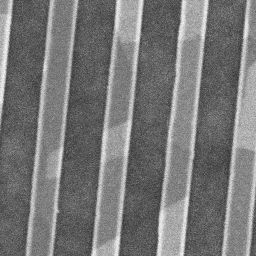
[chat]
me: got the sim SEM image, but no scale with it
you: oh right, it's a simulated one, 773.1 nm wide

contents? one or a few lines or trenches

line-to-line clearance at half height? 41.5 px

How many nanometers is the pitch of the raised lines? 197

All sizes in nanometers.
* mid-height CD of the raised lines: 73.4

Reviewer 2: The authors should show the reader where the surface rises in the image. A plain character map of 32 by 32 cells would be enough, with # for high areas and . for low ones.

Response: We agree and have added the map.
#.....####.....###.....###.....#
#.....####.....###.....###.....#
#.....###......##......###.....#
#.....###.....###......###.....#
#.....###.....###......##......#
#.....###.....###.....###......#
#.....###.....###.....###.....##
#.....###.....###.....###.....##
#.....###.....###.....###.....##
.....####.....###.....###.....##
.....####.....###.....###.....##
.....###......###.....###.....##
.....###......###.....###.....##
.....###.....###......###.....##
.....###.....###......##......##
.....###.....###.....###......##
.....###.....###.....###.....###
.....###.....###.....###.....###
.....###.....###.....###.....###
.....###.....###.....###.....###
.....###.....###.....###.....###
....###......###.....###.....###
....###......##......###.....###
....###.....###.....####.....###
....###.....###.....####.....###
....###.....###.....###.....####
....###.....###.....###.....####
....###.....###.....###.....###.
....###.....###.....###.....###.
....###.....###.....###.....###.
....###.....###.....###.....###.
...###......###.....###.....###.